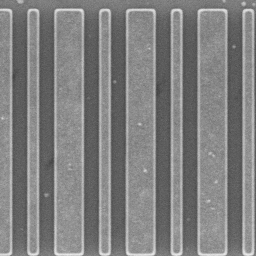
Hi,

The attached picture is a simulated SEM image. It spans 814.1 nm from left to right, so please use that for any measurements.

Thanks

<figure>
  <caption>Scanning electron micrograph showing groups of lines, slits or small figures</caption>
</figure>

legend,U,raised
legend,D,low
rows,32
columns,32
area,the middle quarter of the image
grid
UUUUUDDDDUUUDDDDUUUUUUUDDDDUUDDD
UUUUUDDDDUUUDDDDUUUUUUUDDDDUUDDD
UUUUUDDDDUUUDDDDUUUUUUUDDDDUUDDD
UUUUUDDDDUUUDDDDUUUUUUUDDDDUUDDD
UUUUUDDDDUUUDDDDUUUUUUUDDDDUUDDD
UUUUUDDDDUUUDDDDUUUUUUUDDDDUUDDD
UUUUUDDDDUUUDDDDUUUUUUUDDDDUUDDD
UUUUUDDDDUUUDDDDUUUUUUUDDDDUUDDD
UUUUUDDDDUUUDDDDUUUUUUUDDDDUUDDD
UUUUUDDDDUUUDDDDUUUUUUUDDDDUUDDD
UUUUUDDDDUUUDDDDUUUUUUUDDDDUUDDD
UUUUUDDDDUUUDDDDUUUUUUUDDDDUUDDD
UUUUUDDDDUUUDDDDUUUUUUUDDDDUUDDD
UUUUUDDDDUUUDDDDUUUUUUUDDDDUUDDD
UUUUUDDDDUUUDDDDUUUUUUUDDDDUUDDD
UUUUUDDDDUUUDDDDUUUUUUUDDDDUUDDD
UUUUUDDDDUUUDDDDUUUUUUUDDDDUUDDD
UUUUUDDDDUUUDDDDUUUUUUUDDDDUUDDD
UUUUUDDDDUUUDDDDUUUUUUUDDDDUUDDD
UUUUUDDDDUUUDDDDUUUUUUUDDDDUUDDD
UUUUUDDDDUUUDDDDUUUUUUUDDDDUUDDD
UUUUUDDDDUUUDDDDUUUUUUUDDDDUUDDD
UUUUUDDDDUUDDDDDUUUUUUUDDDDUUDDD
UUUUUDDDDUUDDDDDUUUUUUUDDDDUUDDD
UUUUUDDDDUUDDDDDUUUUUUUDDDDUUDDD
UUUUUDDDDUUDDDDDUUUUUUUDDDDUUDDD
UUUUUDDDDUUDDDDDUUUUUUUDDDDUUDDD
UUUUUDDDDUUDDDDDUUUUUUUDDDDUUDDD
UUUUUDDDDUUDDDDDUUUUUUUDDDDUUDDD
UUUUUDDDDUUDDDDDUUUUUUUDDDDUUDDD
UUUUUDDDDUUDDDDDUUUUUUUDDDDUUDDD
UUUUUDDDDUUDDDDDUUUUUUUDDDDUUDDD